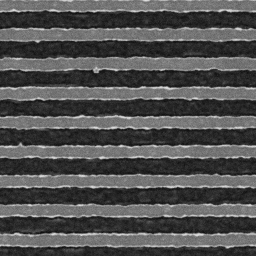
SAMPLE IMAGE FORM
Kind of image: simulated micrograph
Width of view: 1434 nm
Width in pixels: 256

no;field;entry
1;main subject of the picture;parallel lines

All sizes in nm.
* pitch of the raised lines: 164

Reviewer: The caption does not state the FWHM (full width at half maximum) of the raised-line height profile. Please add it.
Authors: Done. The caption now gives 66.5 nanometres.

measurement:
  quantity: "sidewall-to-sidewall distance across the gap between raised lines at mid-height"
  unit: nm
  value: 98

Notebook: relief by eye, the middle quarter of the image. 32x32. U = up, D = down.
UUUUUUUUUUUUUUUUUUUUUUUUUUUUUUUU
UDDDDDDUUDDDDDDDDDDDDUDDUDDDDUUU
DDDDDDDDDDDDDDDDDDDDDDDDDDDDDDDD
DDDDDDDDDDDDDDDDDDDDDDDDDDDDDDDD
DDDDDDDDDDDDDDDDDDDDDDDDDDDDDDDD
DDDDDDDDDDDDDDDDDDDDDDDDDDDDDDDD
UUUUUUUUUUUUUUUUUUUUUUUUUUUUUUUU
UUUUUUUUUUUUUUUUUUUUUUUUUUUUUUUU
UUUUUUUUUUUUUUUUUUUUUUUUUUUUUUUU
DDDDDDDDDDDDDDDDDDDDDDDDDDDDDDDD
DDDDDDDDDDDDDDDDDDDDDDDDDDDDDDDD
DDDDDDDDDDDDDDDDDDDDDDDDDDDDDDDD
DDDDDDDDDDDDDDDDDDDDDDDDDDDDDDDD
UUUUUUUUUUUUUUUUDUUUUUUUUUUUUUUU
UUUUUUUUUUUUUUUUUUUUUUUUUUUUUUUU
UUUUUUUUUUUUUUUUUUUUUUUUUUUUUUUU
DDDDDDDDDDDDDDDDDDDDDDDDDDDDDDDD
DDDDDDDDDDDDDDDDDDDDDDDDDDDDDDDD
DDDDDDDDDDDDDDDDDDDDDDDDDDDDDDDD
DDDDDDDDDDDDDDDDDDDDDDDDDDDDDDDD
UUDUDUUUDDUUDDUDDDDUUUUUUUDDUUDU
UUUUUUUUUUUUUUUUUUUUUUUUUUUUUUUU
UUUUUUUUUUUUUUUUUUUUUUUUUUUUUUUU
DDDDDDUUDDDDDDDDDDDDDDDDDDDDDDDD
DDDDDDDDDDDDDDDDDDDDDDDDDDDDDDDD
DDDDDDDDDDDDDDDDDDDDDDDDDDDDDDDD
DDDDDDDDDDDDDDDDDDDDDDDDDDDDDDDD
DDDDDDDDDDDDDDDDDDDDDDDDDDDDDDDD
UUUUUUUUUUUUUUUUUUUUUUUUUUUUUUUU
UUUUUUUUUUUUUUUUUUUUUUUUUUUUUUUU
DUUUUUUUUUUUUUUUUUUUUUUUUUUUUUUU
DDDDDDDDDDDDDDDDDDDDDDDDDDDDDDDD